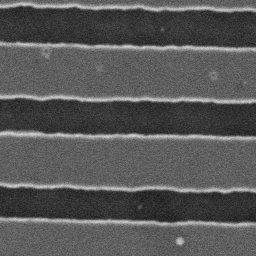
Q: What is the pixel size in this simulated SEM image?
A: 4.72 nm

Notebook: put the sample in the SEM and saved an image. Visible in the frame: lines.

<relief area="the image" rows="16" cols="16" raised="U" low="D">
DDDDDUUUUUUUUUUU
DDDDDDDDDDDDDDDD
DDDDDDDDDDDDDDDD
UUUUUUUUUUUUUUUU
UUUUUUUUUUUUUUUU
UUUUUUUUUUUUUUUU
DDDDDDDDDDDDDDDD
DDDDDDDDDDDDDDDD
UUUUUUUUUUUUUDDD
UUUUUUUUUUUUUUUU
UUUUUUUUUUUUUUUU
UUUUUUUUUUUUUUUU
DDDDDDDDDDDDDDDD
DDDDDDDDDDDDDDDD
UUUUUUUUUUUUUUUU
UUUUUUUUUUUUUUUU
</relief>